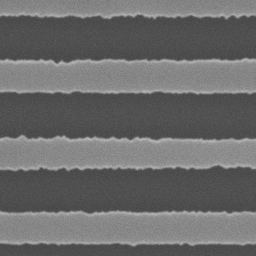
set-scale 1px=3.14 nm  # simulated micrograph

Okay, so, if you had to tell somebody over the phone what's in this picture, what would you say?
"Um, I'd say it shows lines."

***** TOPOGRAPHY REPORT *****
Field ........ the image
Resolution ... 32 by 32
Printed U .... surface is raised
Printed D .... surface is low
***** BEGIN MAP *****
UUUUUUUUUUUUUUUUUUUUUUUUUUUUUUUU
UUUUUUUUUUUUUUUUUUUUUUUUUUUUUUUU
DDDDDDDDDDDDDDDDDDDDDDDDDDDDDDDD
DDDDDDDDDDDDDDDDDDDDDDDDDDDDDDDD
DDDDDDDDDDDDDDDDDDDDDDDDDDDDDDDD
DDDDDDDDDDDDDDDDDDDDDDDDDDDDDDDD
DDDDDDDDDDDDDDDDDDDDDDDDDDDDDDDD
DDDDDDDDDDDDDUDDDDDDUDDDDDUDDDUU
UUUUUUUUUUUUUUUUUUUUUUUUUUUUUUUU
UUUUUUUUUUUUUUUUUUUUUUUUUUUUUUUU
UUUUUUUUUUUUUUUUUUUUUUUUUUUUUUUU
DDUUUUUUUDUUUUUUUUUDUUUUUUUUUUUU
DDDDDDDDDDDDDDDDDDDDDDDDDDDDDDDD
DDDDDDDDDDDDDDDDDDDDDDDDDDDDDDDD
DDDDDDDDDDDDDDDDDDDDDDDDDDDDDDDD
DDDDDDDDDDDDDDDDDDDDDDDDDDDDDDDD
DDDDDDDDDDDDDDDDDDDDDDDDDDDDDDDD
UUUUUUUUUUUUUUUUUUUDUUUUUDDDUUUU
UUUUUUUUUUUUUUUUUUUUUUUUUUUUUUUU
UUUUUUUUUUUUUUUUUUUUUUUUUUUUUUUU
UUUUUUUUUUUUUUUUUUUUUUUUUUUUUUUU
DDDDDDDDDDDDDDDDDDDDDDDDDDDDDDDD
DDDDDDDDDDDDDDDDDDDDDDDDDDDDDDDD
DDDDDDDDDDDDDDDDDDDDDDDDDDDDDDDD
DDDDDDDDDDDDDDDDDDDDDDDDDDDDDDDD
DDDDDDDDDDDDDDDDDDDDDDDDDDDDDDDD
DDDDDUDDDUDDDDUUDDDDUUUUUDDDDDUD
UUUUUUUUUUUUUUUUUUUUUUUUUUUUUUUU
UUUUUUUUUUUUUUUUUUUUUUUUUUUUUUUU
UUUUUUUUUUUUUUUUUUUUUUUUUUUUUUUU
DDDDDDDDDDDDDDDDUDDDDDDDUDDDDDUD
DDDDDDDDDDDDDDDDDDDDDDDDDDDDDDDD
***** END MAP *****